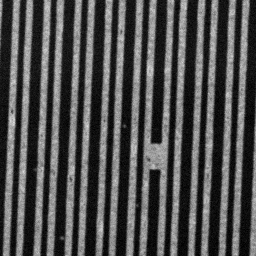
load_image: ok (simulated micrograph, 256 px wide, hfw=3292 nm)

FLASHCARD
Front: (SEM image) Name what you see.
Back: parallel lines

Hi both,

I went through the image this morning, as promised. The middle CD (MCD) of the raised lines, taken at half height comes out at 0.0755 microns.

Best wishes